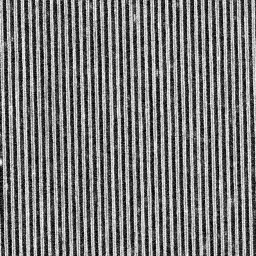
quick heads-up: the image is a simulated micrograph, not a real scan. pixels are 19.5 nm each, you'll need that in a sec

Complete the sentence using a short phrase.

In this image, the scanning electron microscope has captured parallel lines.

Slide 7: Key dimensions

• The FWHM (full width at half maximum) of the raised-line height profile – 51.2 nm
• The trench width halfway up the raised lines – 0.0926 µm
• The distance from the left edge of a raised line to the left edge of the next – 140 nanometers